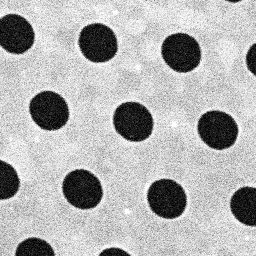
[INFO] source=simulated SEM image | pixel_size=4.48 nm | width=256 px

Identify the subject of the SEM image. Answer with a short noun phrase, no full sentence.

holes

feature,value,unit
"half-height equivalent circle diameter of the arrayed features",182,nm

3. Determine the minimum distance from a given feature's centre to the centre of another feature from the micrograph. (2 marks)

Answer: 0.376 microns